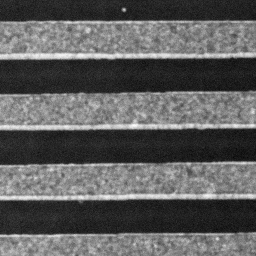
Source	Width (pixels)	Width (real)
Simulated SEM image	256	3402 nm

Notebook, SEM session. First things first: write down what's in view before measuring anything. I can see lines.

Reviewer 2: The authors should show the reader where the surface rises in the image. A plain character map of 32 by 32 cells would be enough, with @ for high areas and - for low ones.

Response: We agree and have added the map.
--------------------------------
--------------------------------
--------------------------------
@@@@@@@@@@@@@@@@@@@@@@@@@@@@@@@@
@@@@@@@@@@@@@@@@@@@@@@@@@@@@@@@@
@@@@@@@@@@@@@@@@@@@@@@@@@@@@@@@@
@@@@@@@@@@@@@@@@@@@@@@@@@@@@@@@@
--------------------------------
--------------------------------
--------------------------------
--------------------------------
--------------------------------
@@@@@@@@@@@@@@@@@@@@@@@@@@@@@@@@
@@@@@@@@@@@@@@@@@@@@@@@@@@@@@@@@
@@@@@@@@@@@@@@@@@@@@@@@@@@@@@@@@
@@@@@@@@@@@@@@@@@@@@@@@@@@@@@@@@
--------------------------------
--------------------------------
--------------------------------
--------------------------------
---------------------@@@@@@@@@@@
@@@@@@@@@@@@@@@@@@@@@@@@@@@@@@@@
@@@@@@@@@@@@@@@@@@@@@@@@@@@@@@@@
@@@@@@@@@@@@@@@@@@@@@@@@@@@@@@@@
@@@@@@@@@@@@@@@@@@@@@--@@@@@@---
--------------------------------
--------------------------------
--------------------------------
--------------------------------
@@@@@@@@@@@@@@@@@@@@@@@@@@@@@@@@
@@@@@@@@@@@@@@@@@@@@@@@@@@@@@@@@
@@@@@@@@@@@@@@@@@@@@@@@@@@@@@@@@